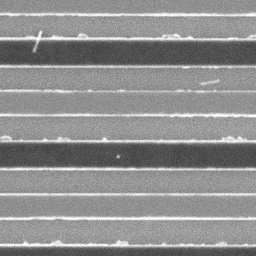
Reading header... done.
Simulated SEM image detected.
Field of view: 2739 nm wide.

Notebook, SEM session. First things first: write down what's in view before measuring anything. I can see lines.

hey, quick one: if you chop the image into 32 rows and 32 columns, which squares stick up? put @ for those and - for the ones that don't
@@@@@@@@@@@@@@@@@@@@@@@@@@@@@@@@
@@@@@@@@@@@@@@@@@@@@@@@@@@@@@@@@
--------------------------------
--------------------------------
--------------------------------
@@@@@@@@@@@@@@@@@@@@@@@@@@@@@@@@
@@@@@@@@@@@@@@@@@@@@@@@@@@@@@@@@
@@@@@@@@@@@@@@@@@@@@@@@@@@@@@@@@
--------------------------------
--------------------------------
--------------------------------
@@@@@@@@@@@@@@@@@@@@@@@@@@@@@@@@
@@@@@@@@@@@@@@@@@@@@@@@@@@@@@@@@
@@@@@@@@@@@@@@@@@@@@@@@@@@@@@@@@
--------------------------------
--------------------------------
--------------------------------
--------------------------------
@@@@@@@@@@@@@@@@@@@@@@@@@@@@@@@@
@@@@@@@@@@@@@@@@@@@@@@@@@@@@@@@@
@@@@@@@@@@@@@@@@@@@@@@@@@@@@@@@@
--------------------------------
--------------------------------
--------------------------------
@@@@@@@@@@@@@@@@@@@@@@@@@@@@@@@@
@@@@@@@@@@@@@@@@@@@@@@@@@@@@@@@@
@@@@@@@@@@@@@@@@@@@@@@@@@@@@@@@@
--------------------------------
--------------------------------
--------------------------------
--------------------------------
@@@@@@@@@@@@@@@@@@@@@@@@@@@@@@@@